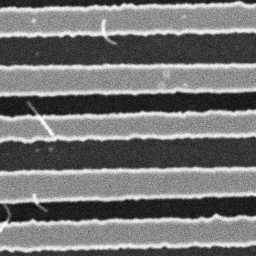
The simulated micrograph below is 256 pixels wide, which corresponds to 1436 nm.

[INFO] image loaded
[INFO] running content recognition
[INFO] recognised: lines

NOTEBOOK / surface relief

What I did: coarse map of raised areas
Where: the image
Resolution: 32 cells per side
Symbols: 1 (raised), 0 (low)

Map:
00000000000000000000000000111110
11111111111111111111111111111111
11111111111111111111111111111111
11111111111111111111111111111111
11010100000000000000000000000000
00000000000000000000000000000000
00000000000000000000000000000000
00000000000000000000000000000000
11111111111111111111111111111111
11111111111111111111111111111111
11111111111111111111111111111111
11111111111111111111111111111110
00000000000000000000000000000000
00000000000000000000000000000000
00011010111111111111111111111111
11111111111111111111111111111111
11111111111111111111111111111111
11111110100000000000000000000000
00000000000000000000000000000000
00000000000000000000000000000000
00000000000000000000000000000000
11111111111111111111111111111111
11111111111111111111111111111111
11111111111111111111111111111111
11111111111111111111111111111110
00000000000000000000000000000000
00000000000000000000000000000000
00000000000001111111111111111111
11111111111111111111111111111111
11111111111111111111111111111111
11111111111111111111111111111111
00000000000000000000000000000000